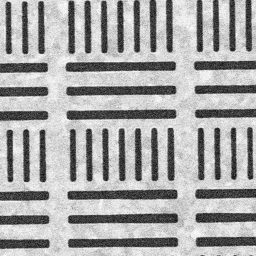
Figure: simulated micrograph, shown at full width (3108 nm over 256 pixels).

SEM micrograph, groups of lines, slits or small figures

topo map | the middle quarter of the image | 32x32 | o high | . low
............................oooo
............................oooo
oooooooooooooooooooooooooooooooo
oooooooooooooooooooooooooooooooo
oooooooooooooooooooooooooooooooo
o...........................oooo
............................oooo
............................oooo
oooooooooooooooooooooooooooooooo
oooooooooooooooooooooooooooooooo
oooooooooooooooooooooooooooooooo
o...........................oooo
............................oooo
o...........................oooo
oooooooooooooooooooooooooooooooo
oooooooooooooooooooooooooooooooo
o..oo..oo..oo..ooo.ooo..oo..oooo
o..oo..oo..oo..oo..ooo..oo..oooo
o..oo..oo..oo..oo..ooo..oo..oooo
o..oo..oo..oo..oo..ooo..oo..oooo
o..oo..oo..oo..oo..ooo..oo..oooo
o..oo..oo..oo..oo...oo..oo..oooo
o..oo..oo..oo..ooo..oo..oo..oooo
o..oo..oo..oo..ooo..oo..oo..oooo
o..oo..oo..oo..ooo..oo..oo..oooo
o..oo..oo..oo..ooo..oo..oo..oooo
o..oo..oo..ooo.ooo..oo..oo..oooo
o..oo..oo..ooo.ooo..oo..oo..oooo
o..oo..ooo.ooo.ooo..oo..oo..oooo
oooooooooooooooooooooooooooooooo
oooooooooooooooooooooooooooooooo
oo..........................oooo